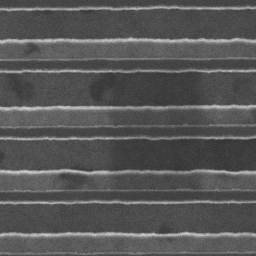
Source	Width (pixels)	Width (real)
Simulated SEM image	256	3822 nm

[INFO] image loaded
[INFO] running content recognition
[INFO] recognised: lines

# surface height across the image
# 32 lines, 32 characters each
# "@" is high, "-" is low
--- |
@@@@@@@@@@@@@@@@@@@@@@@@@@@@@@@@
--------------------------------
--------------------------------
--------------------------------
--------------------------------
@@@@@@@@@@@@@@@@@@@@@@@@@@@@@@@@
@@@@@@@@@@@@@@@@@@@@@@@@@@@@@@@@
@@@@@@@@@@@@@@@@@@@@@@@@@@@@@@@@
@@@@@@@@@@@@@@@@@@@@@@@@@@@@@@@@
--------------------------------
--------------------------------
--------------------------------
--------------------------------
------@@@@@@@@@@@@@@@@@@@@@@@@@@
@@@@@@@@@@@@@@@@@@@@@@@@@@@@@@@@
@@@@@@@@@@@@@@@@@@@@@@@@@@@@@@@@
@@@@@@@@@@@@@@@@@@@@@@@@@@@@@@@@
--------------------------------
--------------------------------
--------------------------------
--------------------------------
-------@@-------@-------@@@-----
@@@@@@@@@@@@@@@@@@@@@@@@@@@@@@@@
@@@@@@@@@@@@@@@@@@@@@@@@@@@@@@@@
@@@@@@@@@@@@@@@@@@@@@@@@@@@@@@@@
--------------------------------
--------------------------------
--------------------------------
--------------------------------
@@@@@@@@@@@@@@@@@@@@@@@@@@@@@@@@
@@@@@@@@@@@@@@@@@@@@@@@@@@@@@@@@
@@@@@@@@@@@@@@@@@@@@@@@@@@@@@@@@